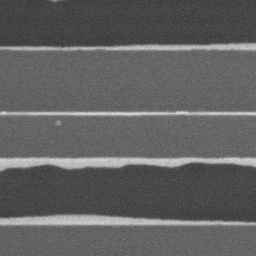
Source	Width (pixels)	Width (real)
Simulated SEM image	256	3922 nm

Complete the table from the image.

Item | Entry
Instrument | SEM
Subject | lines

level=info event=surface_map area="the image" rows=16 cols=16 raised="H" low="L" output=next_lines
LLLLLLLLLLLLLLLL
LLLLLLLLLLLLLLLL
LLLLLLLLLLLLLLLL
HHHHHHHHHHHHHHHH
HHHHHHHHHHHHHHHH
HHHHHHHHHHHHHHHH
HHHHHHHHHHHHHHHH
HHHHHHHHHHHHHHHH
HHHHHHHHHHHHHHHH
HHHHHHHHHHHHHHHH
LLLLLLLLLLLLLLLL
LLLLLLLLLLLLLLLL
LLLLLLLLLLLLLLLL
LLLLLLLLLLLLLLLL
HHHHHHHHHHHHHHHH
HHHHHHHHHHHHHHHH